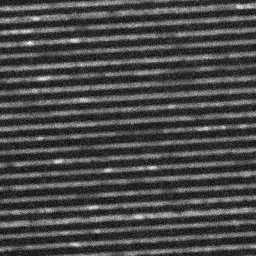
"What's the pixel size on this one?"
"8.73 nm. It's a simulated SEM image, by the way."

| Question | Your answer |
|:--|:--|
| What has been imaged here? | parallel lines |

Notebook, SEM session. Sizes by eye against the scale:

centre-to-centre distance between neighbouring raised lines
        104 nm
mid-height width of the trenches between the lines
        75.1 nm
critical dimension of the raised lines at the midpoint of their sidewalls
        29.4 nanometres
